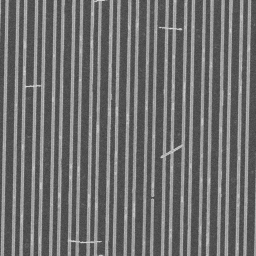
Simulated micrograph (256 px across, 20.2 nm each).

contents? parallel lines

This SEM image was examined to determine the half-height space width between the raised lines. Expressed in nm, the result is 156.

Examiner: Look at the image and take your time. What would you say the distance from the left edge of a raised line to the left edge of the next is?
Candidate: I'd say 0.188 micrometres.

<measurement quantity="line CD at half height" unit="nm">52.9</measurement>